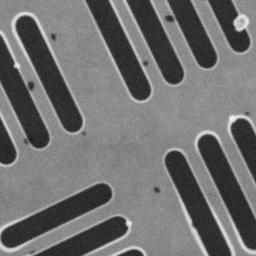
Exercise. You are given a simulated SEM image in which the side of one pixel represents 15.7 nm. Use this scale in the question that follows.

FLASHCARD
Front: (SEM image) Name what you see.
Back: groups of lines, slits or small figures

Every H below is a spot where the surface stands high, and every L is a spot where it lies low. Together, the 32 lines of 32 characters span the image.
HHHHHHHHHHHLLLHHLLLHHLLLHHLLLHHH
HHHHHHHHHHHLLLHHLLLLHLLLLHHLLLHH
HHLLLHHHHHHHLLLHHLLLHHLLLHHLLHHH
HHLLLHHHHHHHLLLHHLLLHHHLLLHHLLHH
HHLLLLHHHHHHHLLLHHLLLHHLLLHHLLLH
LHHLLLHHHHHHHLLLHHLLLHHLLLLHHLLH
LHHLLLHHHHHHHHLLLHHLLLHHLLLHHHHH
LLHHLLLHHHHHHHLLLHHLLLHHLLLHHHHH
LLHHLLLHHHHHHHHLLLHHLLLHHLHHHHHH
LLLHHLLLHHHHHHHLLLHHLLLHHHHHHHHH
LLLHHLLLHHHHHHHHLLLHHLHHHHHHHHHH
HLLLHHLLLHHHHHHHLLLHHHHHHHHHHHHH
HLLLHHLLLHHHHHHHHLHHHHHHHHHHHHHH
HHLLLHHLLLHHHHHHHHHHHHHHHHHHHHHH
HHLLLHHLLLHHHHHHHHHHHHHHHHHHHHHH
LHLLLLHHLLHHHHHHHHHHHHHHHHHHHLLH
LHHLLLHHHLHHHHHHHHHHHHHHHHHHHLLL
LLHHLLHHHHHHHHHHHHHHHHHHHLLHHLLL
LLHHHHHHHHHHHHHHHHHHHHHHHLLLHHLL
LLHHHHHHHHHHHHHHHHHHHLLHHLLLHHLL
LHHHHHHHHHHHHHHHHHHHHLLLHHLLLHHL
HHHHHHHHHHHHHHHHHHHHHLLLHHLLLHHL
HHHHHHHHHHHHHHHHHHHHHLLLLHHLLLHH
HHHHHHHHHHHLLLHHHHHHHHLLLHHLLLHH
HHHHHHHHHLLLLLHHHHHHHHLLLLHHLLLH
HHHHHHHLLLLLLHHHHHHHHHHLLLHHLLLH
HHHHHLLLLLLHHHHHHHHHHHHLLLLHHLLL
HHHLLLLLLHHHHLLLHHHHHHHHLLLHHLLL
LLLLLLLHHHHLLLLLHHHHHHHHLLLLHLLL
LLLLLHHHHLLLLLLLHHHHHHHHHLLLHHLL
LLLHHHHLLLLLLLHHHHHHHHHHHLLLLHLL
HHHHHLLLLLLHHHHLLLHHHHHHHHLLLHHH